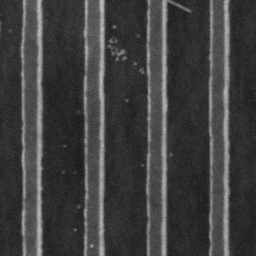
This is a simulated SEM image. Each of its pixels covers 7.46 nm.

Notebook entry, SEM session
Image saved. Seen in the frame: lines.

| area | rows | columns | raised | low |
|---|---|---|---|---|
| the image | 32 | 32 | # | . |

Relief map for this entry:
...##......##.....###.....##....
...##......##.....###.....##....
...##......##.....###.....##....
...##......##.....###.....##....
...##......##.....###.....##....
...##......##.....###.....##....
...##......##.....###.....##....
...##......##.....###.....##....
...##......##.....###.....##....
...##......##.....###.....##....
...##......##......##.....##....
...##......##......##.....##....
...##......##.....###.....##....
...##......##......##.....##....
...##......##.....###.....##....
...##......##......##.....##....
...##......##......##.....##....
...##......##......##.....##....
...##......##......##.....##....
...##......##.....###.....##....
...##......##.....###.....##....
...##......##.....###.....##....
...##......##.....###.....##....
...##......##.....###.....##....
...##......##.....###.....##....
...##......##.....###.....##....
...##......##.....###.....##....
...##......##.....###.....##....
...##......##.....###.....##....
...##......##.....###.....##....
...##......##.....###.....##....
...##......##.....###.....##....